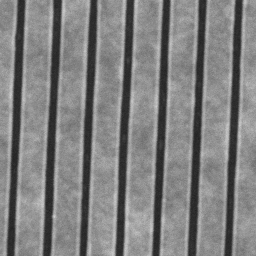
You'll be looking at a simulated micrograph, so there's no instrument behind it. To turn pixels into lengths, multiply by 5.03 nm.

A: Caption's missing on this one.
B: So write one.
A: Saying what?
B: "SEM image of parallel lines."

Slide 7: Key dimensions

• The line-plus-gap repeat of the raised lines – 0.182 µm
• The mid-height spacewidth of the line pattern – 56.5 nm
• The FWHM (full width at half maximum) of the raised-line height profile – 0.127 microns